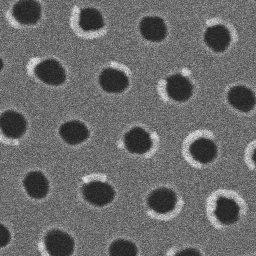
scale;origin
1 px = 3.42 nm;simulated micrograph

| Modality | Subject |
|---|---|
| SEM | a regular array of holes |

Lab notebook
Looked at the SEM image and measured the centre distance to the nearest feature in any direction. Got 217 nanometres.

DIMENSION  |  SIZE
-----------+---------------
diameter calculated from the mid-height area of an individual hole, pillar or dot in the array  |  89 nm